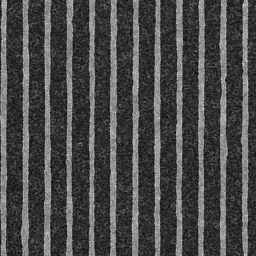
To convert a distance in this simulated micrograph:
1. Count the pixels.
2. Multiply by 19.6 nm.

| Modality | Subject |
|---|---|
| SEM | parallel lines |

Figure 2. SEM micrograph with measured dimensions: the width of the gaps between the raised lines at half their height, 331 nm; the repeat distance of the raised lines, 22 pixels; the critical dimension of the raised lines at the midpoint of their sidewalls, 0.0956 um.